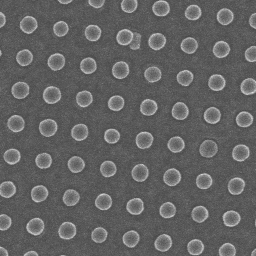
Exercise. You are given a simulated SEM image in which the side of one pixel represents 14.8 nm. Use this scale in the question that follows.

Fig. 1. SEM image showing a regular array of raised bodies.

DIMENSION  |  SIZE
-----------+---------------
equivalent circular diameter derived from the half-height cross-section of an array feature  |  237 nanometers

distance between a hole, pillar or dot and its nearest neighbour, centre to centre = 476 nm